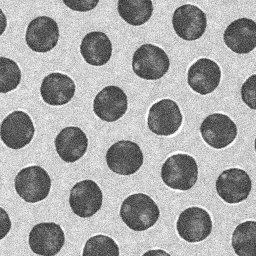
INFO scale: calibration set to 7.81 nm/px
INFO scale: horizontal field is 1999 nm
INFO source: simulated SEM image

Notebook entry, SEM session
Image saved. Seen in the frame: a regular array of holes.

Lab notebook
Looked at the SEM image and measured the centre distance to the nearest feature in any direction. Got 431 nanometers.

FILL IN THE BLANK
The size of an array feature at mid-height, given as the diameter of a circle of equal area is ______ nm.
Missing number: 283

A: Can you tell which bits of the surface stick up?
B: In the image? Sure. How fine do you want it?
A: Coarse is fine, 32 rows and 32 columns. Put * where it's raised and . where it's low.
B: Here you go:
********....***....*************
***************....***...*******
.***...********....***....***...
.**....***************....**....
***....****..*********...***....
***....***....****.*********....
*****.****....***....********..*
..*********...***....****..*****
...**************....**.....****
...***...********...***.....***.
..***....**************....***..
.****....***....********...***..
*****....***....****..********..
************....***...*********.
*...********...***.....***...***
....**************.....**....***
....***....********...***.....**
....***....**************....***
*..****....***...*********..****
*******...***.....***...********
*************.....**.....*******
**....********...***.....***...*
**....****.*********.....**....*
**....***....********...***....*
**....***....***...********....*
*********....**.....************
.********...***.....***...******
.**************.....**.....*****
.***....********...***....***...
.***....****..********....***...
****....**.....**************...
****...***.....***...********...